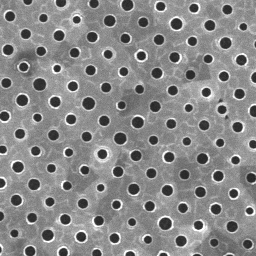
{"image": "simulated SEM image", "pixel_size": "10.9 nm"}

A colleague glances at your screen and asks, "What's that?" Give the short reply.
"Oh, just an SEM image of a regular array of holes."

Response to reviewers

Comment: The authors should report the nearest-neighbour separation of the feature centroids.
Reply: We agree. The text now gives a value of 0.255 microns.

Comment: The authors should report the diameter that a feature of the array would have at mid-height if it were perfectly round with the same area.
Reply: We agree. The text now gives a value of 112 nm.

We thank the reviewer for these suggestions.